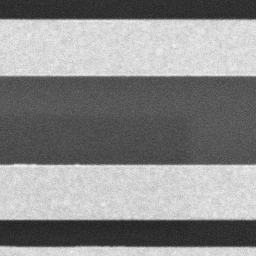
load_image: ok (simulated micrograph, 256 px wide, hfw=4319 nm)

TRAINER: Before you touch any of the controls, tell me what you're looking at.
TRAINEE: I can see lines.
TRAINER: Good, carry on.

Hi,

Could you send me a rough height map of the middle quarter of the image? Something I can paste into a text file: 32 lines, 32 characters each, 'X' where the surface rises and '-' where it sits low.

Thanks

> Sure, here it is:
XXXXXXXXXXXXXXXXXXXXXXXXXXXXXXXX
XXXXXXXXXXXXXXXXXXXXXXXXXXXXXXXX
XXXXXXXXXXXXXXXXXXXXXXXXXXXXXXXX
--------------------------------
--------------------------------
--------------------------------
--------------------------------
--------------------------------
--------------------------------
--------------------------------
--------------------------------
--------------------------------
--------------------------------
--------------------------------
--------------------------------
--------------------------------
--------------------------------
--------------------------------
--------------------------------
--------------------------------
--------------------------------
--------------------------------
--------------------------------
--------------------------------
--------------------------------
XXXXXXXXXXXXXXXXXXXXXXXXXXXXXXXX
XXXXXXXXXXXXXXXXXXXXXXXXXXXXXXXX
XXXXXXXXXXXXXXXXXXXXXXXXXXXXXXXX
XXXXXXXXXXXXXXXXXXXXXXXXXXXXXXXX
XXXXXXXXXXXXXXXXXXXXXXXXXXXXXXXX
XXXXXXXXXXXXXXXXXXXXXXXXXXXXXXXX
XXXXXXXXXXXXXXXXXXXXXXXXXXXXXXXX